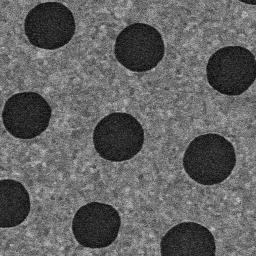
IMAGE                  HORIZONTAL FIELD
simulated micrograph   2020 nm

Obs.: holes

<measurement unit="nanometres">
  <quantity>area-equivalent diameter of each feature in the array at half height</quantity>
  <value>398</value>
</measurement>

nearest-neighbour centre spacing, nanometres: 727